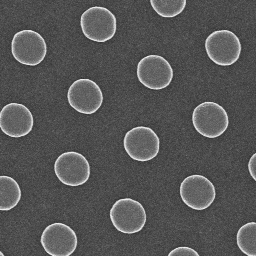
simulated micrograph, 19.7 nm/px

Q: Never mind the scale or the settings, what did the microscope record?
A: a regular array of raised bodies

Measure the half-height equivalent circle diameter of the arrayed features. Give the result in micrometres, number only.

0.682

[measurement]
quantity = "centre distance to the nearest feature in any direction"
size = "1440 nm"